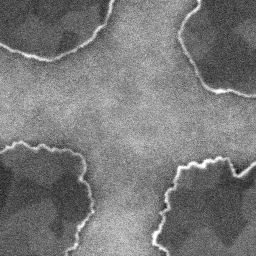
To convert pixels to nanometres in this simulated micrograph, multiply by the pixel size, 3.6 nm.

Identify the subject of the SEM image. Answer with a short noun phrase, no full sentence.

raised bodies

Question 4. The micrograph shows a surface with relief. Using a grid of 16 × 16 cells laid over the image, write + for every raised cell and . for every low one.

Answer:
+++++++.....++++
+++++++....+++++
++++++.....+++++
..++........++++
............++++
.............+++
................
................
................
+++++...........
+++++......++++.
+++++......+++++
++++++....++++++
++++++....++++++
+++++.....++++++
+++++.....++++++